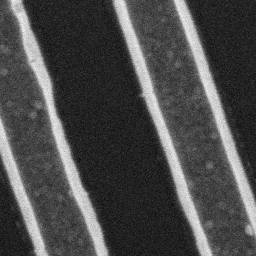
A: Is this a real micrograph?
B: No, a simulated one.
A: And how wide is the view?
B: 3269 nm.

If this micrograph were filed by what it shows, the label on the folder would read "one or a few lines or trenches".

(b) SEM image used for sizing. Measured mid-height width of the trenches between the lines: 97.4 px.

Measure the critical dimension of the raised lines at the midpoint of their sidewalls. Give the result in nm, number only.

747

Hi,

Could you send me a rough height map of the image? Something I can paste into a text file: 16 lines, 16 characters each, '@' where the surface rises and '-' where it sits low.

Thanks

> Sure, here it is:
@-------@@@-----
@-------@@@@----
@@------@@@@----
@@-------@@@----
@@@------@@@@---
@@@------@@@@---
@@@-------@@@---
@@@-------@@@@--
@@@@------@@@@--
@@@@-------@@@--
-@@@-------@@@@-
-@@@@------@@@@-
-@@@@-------@@@@
--@@@@------@@@@
--@@@@------@@@@
--@@@@-------@@@